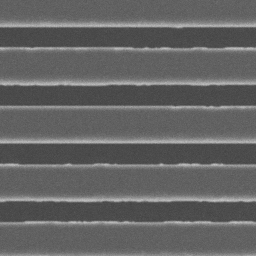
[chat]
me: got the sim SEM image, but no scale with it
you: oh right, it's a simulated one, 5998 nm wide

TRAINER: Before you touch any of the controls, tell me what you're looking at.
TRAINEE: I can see lines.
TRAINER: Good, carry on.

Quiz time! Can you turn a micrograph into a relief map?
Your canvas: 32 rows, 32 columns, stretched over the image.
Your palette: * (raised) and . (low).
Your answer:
********************************
********************************
********************************
................................
................................
................................
********************************
********************************
********************************
********************************
***************.****************
................................
................................
********************************
********************************
********************************
********************************
********************************
................................
................................
................................
********************************
********************************
********************************
********************************
................................
................................
................................
********************************
********************************
********************************
********************************